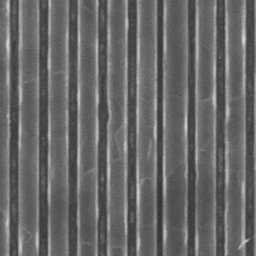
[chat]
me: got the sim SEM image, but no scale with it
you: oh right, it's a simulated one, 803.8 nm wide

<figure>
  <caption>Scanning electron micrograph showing parallel lines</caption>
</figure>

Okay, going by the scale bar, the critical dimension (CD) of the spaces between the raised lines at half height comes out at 9.36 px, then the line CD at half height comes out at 62.8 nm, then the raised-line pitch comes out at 92.7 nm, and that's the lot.